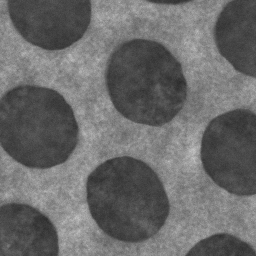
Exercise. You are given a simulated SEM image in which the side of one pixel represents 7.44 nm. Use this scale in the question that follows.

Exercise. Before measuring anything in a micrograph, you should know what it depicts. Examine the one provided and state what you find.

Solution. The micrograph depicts holes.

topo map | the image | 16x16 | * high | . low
......********..
*.....*******...
**...***.****...
*******....***..
*******....****.
*..****.....****
....***....*****
.....***...**...
.....********...
.....********...
**.***...****...
*****.....****..
*****.....******
...***....******
....***...******
....********....